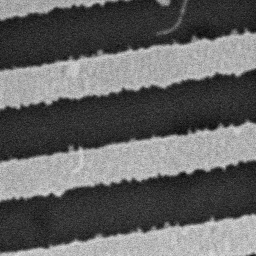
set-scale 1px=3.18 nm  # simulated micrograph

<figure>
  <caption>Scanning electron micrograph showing lines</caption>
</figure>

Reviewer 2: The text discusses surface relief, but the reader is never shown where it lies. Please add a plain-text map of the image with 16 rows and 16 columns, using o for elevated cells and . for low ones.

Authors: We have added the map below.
oooo............
................
.............ooo
......oooooooooo
ooooooooooooooo.
ooooooooo.......
oo..............
................
...........ooooo
....oooooooooooo
ooooooooooooo...
oooooo..........
................
...............o
.........ooooooo
...ooooooooooooo